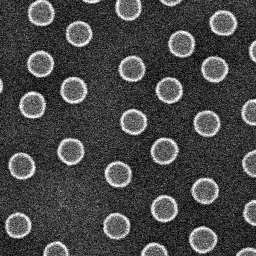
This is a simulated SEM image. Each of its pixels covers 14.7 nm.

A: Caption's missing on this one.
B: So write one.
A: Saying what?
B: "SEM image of a regular array of raised bodies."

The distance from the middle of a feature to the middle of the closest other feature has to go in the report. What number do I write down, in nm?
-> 655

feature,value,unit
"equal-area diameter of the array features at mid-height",25.2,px